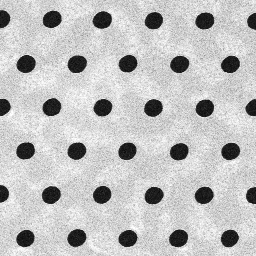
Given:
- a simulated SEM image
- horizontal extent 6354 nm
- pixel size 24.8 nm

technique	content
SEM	a regular array of holes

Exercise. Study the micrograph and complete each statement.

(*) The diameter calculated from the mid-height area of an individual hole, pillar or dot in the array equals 453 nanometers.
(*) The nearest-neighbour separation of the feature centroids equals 1240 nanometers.